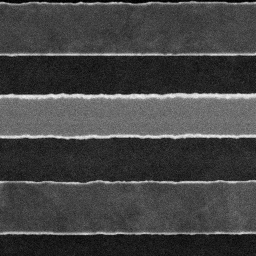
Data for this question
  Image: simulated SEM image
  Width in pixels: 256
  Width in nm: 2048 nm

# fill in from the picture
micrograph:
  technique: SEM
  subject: lines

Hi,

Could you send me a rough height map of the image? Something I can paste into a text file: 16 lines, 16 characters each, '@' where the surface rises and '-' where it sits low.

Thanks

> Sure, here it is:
@@@@@@@@@@@@@@@@
@@@@@@@@@@@@@@@@
@@@@@@@@@@@@@@@@
----------------
----------------
----------------
@@@@@@@@@@@@@@@@
@@@@@@@@@@@@@@@@
@@@@@@@@@@@@@@@@
----------------
----------------
@@@@@@@@@@@@@@@@
@@@@@@@@@@@@@@@@
@@@@@@@@@@@@@@@@
@@@@@@@@@@@@@@@@
----------------